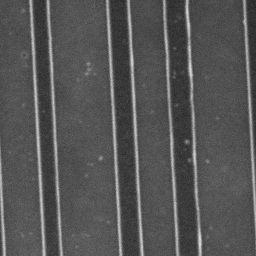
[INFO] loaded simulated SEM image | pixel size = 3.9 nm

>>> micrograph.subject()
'one or a few lines or trenches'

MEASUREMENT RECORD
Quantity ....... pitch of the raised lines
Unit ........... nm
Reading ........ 265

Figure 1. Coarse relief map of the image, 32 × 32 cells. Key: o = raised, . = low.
....oo.......ooo.....oo........o
....oo.......ooo....ooo........o
....oo........oo.....oo........o
....oo........oo.....ooo.......o
....oo........oo.....ooo.......o
....oo........oo.....ooo.......o
....oo........oo.....ooo.......o
....oo........ooo....ooo.......o
....ooo.......ooo....ooo.......o
....ooo.......ooo....ooo.......o
....ooo.......ooo....ooo.......o
....ooo.......ooo....ooo.......o
....ooo.......ooo....ooo.......o
.....oo.......ooo....ooo.......o
.....oo.......ooo....ooo.......o
.....oo.......ooo....ooo.......o
.....oo.......ooo....ooo.......o
.....oo.......ooo....ooo.......o
.....oo.......ooo....ooo........
.....oo.......ooo....ooo.......o
.....oo.......ooo....ooo........
.....oo........oo.....oo........
.....oo........oo.....ooo.......
.....oo........oo.....ooo.......
.....oo........oo.....ooo.......
.....oo........oo.....ooo.......
.....oo........ooo....ooo.......
.....oo........ooo....ooo.......
.....oo........ooo....ooo.......
o....ooo.......ooo....ooo.......
o....ooo.......ooo....ooo.......
o....ooo.......ooo....ooo.......